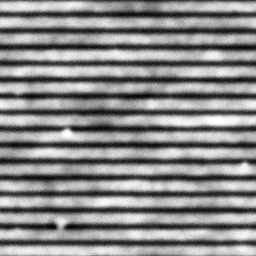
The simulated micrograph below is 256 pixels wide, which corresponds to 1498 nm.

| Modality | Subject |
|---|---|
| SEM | parallel lines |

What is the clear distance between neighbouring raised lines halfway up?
40.2 nm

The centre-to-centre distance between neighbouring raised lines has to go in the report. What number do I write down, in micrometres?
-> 0.0953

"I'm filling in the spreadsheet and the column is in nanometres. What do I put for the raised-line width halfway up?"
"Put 57.1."